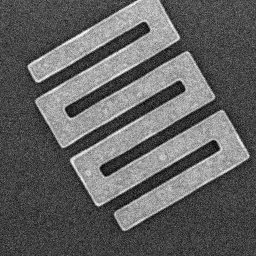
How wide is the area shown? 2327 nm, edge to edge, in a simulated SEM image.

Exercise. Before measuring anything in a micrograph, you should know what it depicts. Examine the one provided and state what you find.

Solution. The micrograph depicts groups of lines, slits or small figures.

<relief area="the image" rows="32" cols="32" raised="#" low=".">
.................###............
...............######...........
.............########...........
...........#####...###..........
..........#####...####..........
........#####...#####...........
......#####....#####............
.....#####...#####....##........
....####...#####....#####.......
....##....####....#######.......
........#####...#####..###......
......#####....#####...####.....
.....#####...#####...#####......
.....###...#####....#####.......
.....###..#####...#####...##....
......#######...#####....####...
.......####....#####...######...
.......##....#####...#########..
...........#####....#####...###.
..........#####...#####....####.
.........####...#####....#####..
..........###..#####...#####....
..........########...#####......
...........#####....#####.......
...........####...#####.........
............#...#####...........
...............#####............
...............###..............
...............#................
................................
................................
................................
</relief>